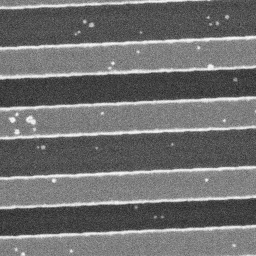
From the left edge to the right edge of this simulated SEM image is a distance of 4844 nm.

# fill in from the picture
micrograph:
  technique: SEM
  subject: lines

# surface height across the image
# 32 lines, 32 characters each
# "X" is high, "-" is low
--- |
XXXXXXXXXXXXX-------------------
--------------------------------
--------------------------------
--------------------------------
--------------------------------
-------------XXXXXXXXXXXXXXXXXXX
XXXXXXXXXXXXXXXXXXXXXXXXXXXXXXXX
XXXXXXXXXXXXXXXXXXXXXXXXXXXXXXXX
XXXXXXXXXXXXXXXXXXXXXXXXXXXXXX--
XXXXXXXXX-----------------------
--------------------------------
--------------------------------
-------------------------XXXXXXX
-XXXXXXXXXXXXXXXXXXXXXXXXXXXXXXX
XXXXXXXXXXXXXXXXXXXXXXXXXXXXXXXX
XXXXXXXXXXXXXXXXXXXXXXXXXXXXXXXX
XXXXXXXXXXXXXXXXXXXXX-----------
--------------------------------
--------------------------------
--------------------------------
--------------------------------
-----------------XXXXXXXXXXXXXXX
XXXXXXXXXXXXXXXXXXXXXXXXXXXXXXXX
XXXXXXXXXXXXXXXXXXXXXXXXXXXXXXXX
XXXXXXXXXXXXXXXXXXXXXXXXXXXXXXXX
XXXXXXXXXXXXX-------------------
--------------------------------
--------------------------------
-------------------------XXXXXXX
--XXXXXXXXXXXXXXXXXXXXXXXXXXXXXX
XXXXXXXXXXXXXXXXXXXXXXXXXXXXXXXX
XXXXXXXXXXXXXXXXXXXXXXXXXXXXXXXX